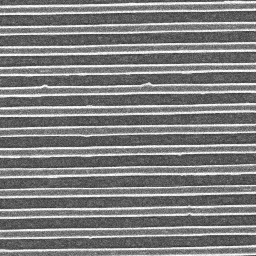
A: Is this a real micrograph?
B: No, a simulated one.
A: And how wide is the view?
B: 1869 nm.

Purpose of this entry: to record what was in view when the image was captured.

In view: parallel lines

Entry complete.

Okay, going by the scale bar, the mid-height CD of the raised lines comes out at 57.5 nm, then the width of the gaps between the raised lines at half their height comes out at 0.0867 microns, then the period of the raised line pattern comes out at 0.149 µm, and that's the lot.